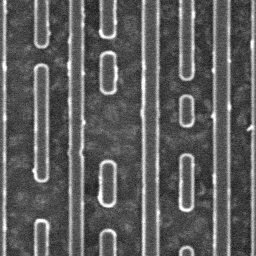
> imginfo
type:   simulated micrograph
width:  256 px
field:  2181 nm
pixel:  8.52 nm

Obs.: parallel lines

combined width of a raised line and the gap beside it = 308 nanometers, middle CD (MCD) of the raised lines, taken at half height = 122 nanometres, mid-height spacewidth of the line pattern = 0.184 µm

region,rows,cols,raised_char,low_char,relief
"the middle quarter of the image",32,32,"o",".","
.oooo....oooo.......oooo.....ooo
.oooo....oooo.......oooo.....ooo
.oooo....oooo.......ooo......ooo
.oooo....oooo.......ooo......ooo
.oooo....oooo......oooo.........
.oooo....oooo.......ooo.........
.oooo....oooo.......ooo.........
.oooo...............ooo.........
.oooo...............ooo......ooo
.oooo...............ooo......ooo
.oooo...............ooo......ooo
..ooo...............oooo.....ooo
.oooo...............oooo.....ooo
..ooo...............ooo......ooo
..ooo...............ooo......ooo
..ooo...............ooo.........
..ooo...............ooo.........
..ooo...............ooo.........
..ooo...............ooo.........
.oooo...............ooo.........
..ooo...............ooo.........
.ooo................ooo.........
.ooo................ooo.........
.oooo...............ooo......ooo
.oooo.....oo........ooo......ooo
.oooo....oooo.......ooo......ooo
.oooo....oooo.......ooo......ooo
.oooo....oooo.......ooo......ooo
.oooo....oooo.......ooo......ooo
.oooo....oooo.......ooo......ooo
.oooo....oooo.......ooo......ooo
.oooo....oooo.......ooo......ooo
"